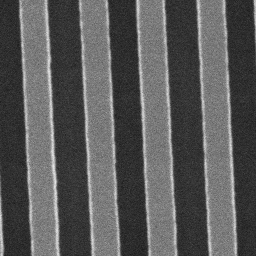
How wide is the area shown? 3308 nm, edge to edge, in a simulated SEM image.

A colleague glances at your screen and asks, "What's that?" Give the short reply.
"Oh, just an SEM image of lines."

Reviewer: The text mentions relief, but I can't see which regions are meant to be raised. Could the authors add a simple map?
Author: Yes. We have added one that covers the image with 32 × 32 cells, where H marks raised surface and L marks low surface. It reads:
LLLHHHLLLLHHHLLLLHHHHLLLLHHHLLLL
LLLHHHLLLLHHHHLLLHHHHLLLLHHHLLLL
LLLHHHLLLLHHHHLLLHHHHLLLLHHHLLLL
LLLHHHLLLLHHHHLLLHHHHLLLLHHHLLLL
LLLHHHLLLLHHHHLLLHHHHLLLLHHHLLLL
LLLHHHLLLLHHHHLLLHHHHLLLLHHHLLLL
LLLHHHLLLLHHHHLLLHHHHLLLLHHHLLLL
LLLHHHLLLLHHHHLLLHHHHLLLLHHHLLLL
LLLHHHLLLLHHHHLLLHHHHLLLLHHHLLLL
LLLHHHLLLLHHHHLLLLHHHLLLLHHHHLLL
LLLHHHLLLLHHHHLLLLHHHLLLLHHHHLLL
LLLHHHLLLLLHHHLLLLHHHLLLLHHHHLLL
LLLHHHLLLLLHHHLLLLHHHLLLLHHHHLLL
LLLHHHHLLLLHHHLLLLHHHLLLLHHHHLLL
LLLHHHHLLLLHHHLLLLHHHLLLLHHHHLLL
LLLHHHHLLLLHHHLLLLHHHLLLLHHHHLLL
LLLHHHHLLLLHHHLLLLHHHLLLLHHHHLLL
LLLHHHHLLLLHHHLLLLHHHLLLLLHHHLLL
LLLHHHHLLLLHHHLLLLHHHLLLLLHHHLLL
LLLHHHHLLLLHHHLLLLHHHHLLLLHHHLLL
LLLHHHHLLLLHHHLLLLHHHHLLLLHHHLLL
LLLLHHHLLLLHHHLLLLHHHHLLLLHHHLLL
LLLLHHHLLLLHHHHLLLHHHHLLLLHHHLLL
LLLLHHHLLLLHHHHLLLHHHHLLLLHHHLLL
LLLLHHHLLLLHHHHLLLHHHHLLLLHHHLLL
LLLLHHHLLLLHHHHLLLHHHHLLLLHHHLLL
LLLLHHHLLLLHHHHLLLHHHHLLLLHHHLLL
LLLLHHHLLLLHHHHLLLHHHHLLLLHHHLLL
LLLLHHHLLLLHHHHLLLHHHHLLLLHHHLLL
LLLLHHHLLLLHHHHLLLLHHHLLLLHHHHLL
LLLLHHHLLLLLHHHLLLLHHHLLLLHHHHLL
LLLLHHHLLLLLHHHLLLLHHHLLLLHHHHLL